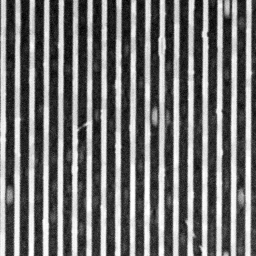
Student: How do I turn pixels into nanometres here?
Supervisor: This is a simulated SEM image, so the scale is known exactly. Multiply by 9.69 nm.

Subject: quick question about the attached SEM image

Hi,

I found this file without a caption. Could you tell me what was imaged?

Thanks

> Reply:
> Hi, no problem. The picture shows parallel lines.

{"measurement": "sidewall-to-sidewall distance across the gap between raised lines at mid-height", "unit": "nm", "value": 102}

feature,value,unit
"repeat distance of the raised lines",140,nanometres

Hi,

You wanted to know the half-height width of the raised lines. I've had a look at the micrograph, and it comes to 0.0375 micrometres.